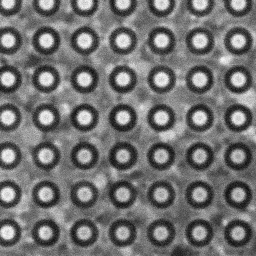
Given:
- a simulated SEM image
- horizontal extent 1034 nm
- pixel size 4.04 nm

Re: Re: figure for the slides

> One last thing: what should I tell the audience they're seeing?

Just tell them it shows an array of small figures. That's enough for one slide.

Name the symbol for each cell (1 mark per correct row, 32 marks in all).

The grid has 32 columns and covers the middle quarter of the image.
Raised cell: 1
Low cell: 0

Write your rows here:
11100001111110001111111000111111
11000000111100000011110000011110
11001100011000100011100010001100
10001110011001110001000111001100
11001110011001110001100111001100
11000100011000000011100010001100
11100000111100000111110000011110
11110001111111001111111000111111
11111111111111111111111111111111
11111111111111111111111111111111
11100001111100000111110000011111
11000000111100000011100000011110
11001100011000110011100111001100
10001110011001110001000111001100
11001100011000110011100111001100
11000000111100000011100000011110
11100001111110000111110000111111
11111111111111111111111111111111
11111111111111111111111111111111
11110011111110001111111001111111
11000000111100000011100000011110
11001100111000100011100000001100
10001110011001110001000111001100
10001110011001110001000111001100
11001100011000000011100110001100
11000000111100000011110000011110
11110001111110001111111000111111
11111111111111111111111111111111
11111111111111111111111111111111
11100001111110000111110000111111
11000000111100000011100000011110
10001100011000110011100110001100